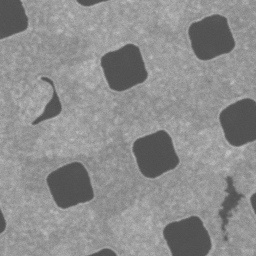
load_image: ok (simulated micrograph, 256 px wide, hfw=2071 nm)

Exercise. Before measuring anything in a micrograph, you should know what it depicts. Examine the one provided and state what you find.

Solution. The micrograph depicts holes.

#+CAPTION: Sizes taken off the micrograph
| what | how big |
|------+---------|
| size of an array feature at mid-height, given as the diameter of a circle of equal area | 370 nanometres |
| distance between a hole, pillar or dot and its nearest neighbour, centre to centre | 0.733 microns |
